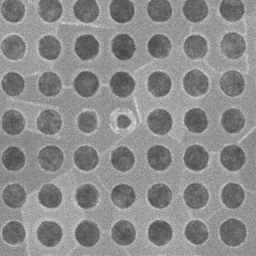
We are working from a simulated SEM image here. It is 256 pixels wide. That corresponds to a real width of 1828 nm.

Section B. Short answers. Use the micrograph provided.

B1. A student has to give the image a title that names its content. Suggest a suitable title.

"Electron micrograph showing a regular array of holes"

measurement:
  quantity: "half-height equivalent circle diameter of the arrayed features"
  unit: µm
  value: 0.18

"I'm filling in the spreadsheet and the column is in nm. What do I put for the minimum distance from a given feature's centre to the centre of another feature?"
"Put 258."